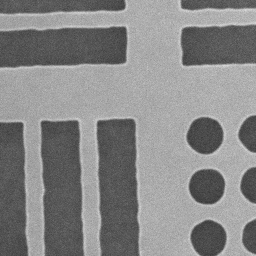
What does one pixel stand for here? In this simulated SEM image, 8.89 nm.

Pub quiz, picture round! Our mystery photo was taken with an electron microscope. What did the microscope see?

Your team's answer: groups of lines, slits or small figures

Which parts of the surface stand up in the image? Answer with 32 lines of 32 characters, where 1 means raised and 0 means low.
00000000000000001111111000000000
00000000000011111111111111111111
11111111111111111111111111111111
11111111000000001111111000000000
00000000000000001111111000000000
00000000000000001111111000000000
00000000000000001111111000000000
00000000000000001111111000000000
00111111111111111111111111111111
11111111111111111111111111111111
11111111111111111111111111111111
11111111111111111111111111111111
11111111111111111111111111111111
11111111111111111111111111111111
11111111111111111111111111111111
00011000001100000111111100001100
00011000001100000111111100001100
00011000001100000111111000001100
00011000001100000111111100011110
00011000001100000111111111111111
00011000001100000111111111111111
00011000001100000111111110011110
00011000001100000111111100001100
00011100001100000111111100001100
00011000001100000111111100001110
00011000001100000111111110011111
00011000001100000111111111111111
00011100001110000111111111111111
00011100001110000011111100001110
00011000000100000111111100001100
00011100000110000111111100001100
00001100000110000011111110001110